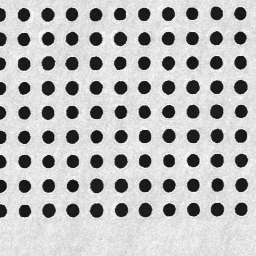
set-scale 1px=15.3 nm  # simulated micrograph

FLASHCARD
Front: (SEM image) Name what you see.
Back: a regular array of holes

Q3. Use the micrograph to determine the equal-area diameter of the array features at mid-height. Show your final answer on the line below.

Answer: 208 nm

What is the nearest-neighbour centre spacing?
0.364 microns